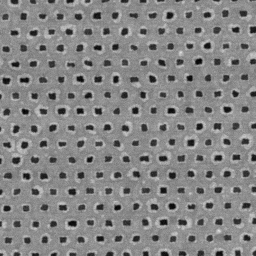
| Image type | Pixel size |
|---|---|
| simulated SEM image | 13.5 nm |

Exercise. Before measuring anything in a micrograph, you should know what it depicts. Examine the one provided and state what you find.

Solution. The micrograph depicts a regular array of holes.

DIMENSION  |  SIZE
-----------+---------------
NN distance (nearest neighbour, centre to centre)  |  17.7 pixels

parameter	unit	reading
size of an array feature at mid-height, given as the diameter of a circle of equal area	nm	101